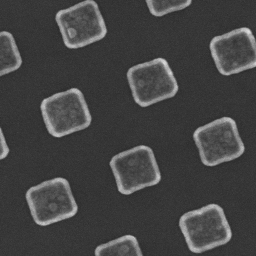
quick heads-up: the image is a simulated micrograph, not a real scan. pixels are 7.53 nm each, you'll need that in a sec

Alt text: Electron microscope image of raised bodies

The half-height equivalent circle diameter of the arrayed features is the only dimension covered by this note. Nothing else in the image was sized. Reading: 329 nm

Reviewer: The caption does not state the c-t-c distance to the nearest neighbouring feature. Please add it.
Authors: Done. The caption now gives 0.669 µm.